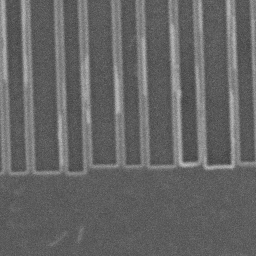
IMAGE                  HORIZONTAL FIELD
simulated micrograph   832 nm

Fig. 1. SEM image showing parallel lines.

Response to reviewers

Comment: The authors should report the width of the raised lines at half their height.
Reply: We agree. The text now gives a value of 25.2 nanometres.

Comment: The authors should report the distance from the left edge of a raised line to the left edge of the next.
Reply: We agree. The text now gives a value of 94.4 nanometres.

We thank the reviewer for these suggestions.